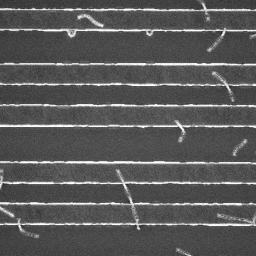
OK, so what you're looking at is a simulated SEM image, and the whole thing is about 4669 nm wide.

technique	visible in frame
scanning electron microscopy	lines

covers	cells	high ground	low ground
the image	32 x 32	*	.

................................
********************************
********************************
********************************
................................
................................
................................
................................
********************************
********************************
..*.****..****..****************
................................
................................
********************************
********************************
********************************
................................
................................
................................
................................
********************************
********************************
********************************
................................
................................
*****.****.****.***.............
********************************
********************************
................................
................................
................................
................................